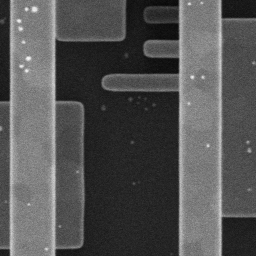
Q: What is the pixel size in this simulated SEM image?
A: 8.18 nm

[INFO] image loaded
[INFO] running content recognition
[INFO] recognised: wiring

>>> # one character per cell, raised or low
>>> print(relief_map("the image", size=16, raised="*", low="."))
.**........***..
.**........***..
.**........***..
.**........***..
.**........***..
.**........***..
.**........***..
.**........***..
.**........***..
.**........***..
.**........***..
.**........***..
.**........***..
.**........***..
.**........***..
.**........***..